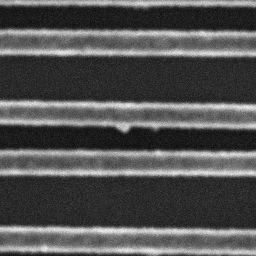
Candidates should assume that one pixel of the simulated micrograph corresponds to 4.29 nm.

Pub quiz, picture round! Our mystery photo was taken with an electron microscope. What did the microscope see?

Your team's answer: lines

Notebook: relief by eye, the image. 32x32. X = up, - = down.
X--XX--XXXXXXXXXXXXXXXXXXXXXXXXX
--------------------------------
--------------------------------
--------------------------------
XXXXXXXXXXXXXXXXXXXXXXXXXXXXXXXX
XXXXXXXXXXXXXXXXXXXXXXXXXXXXXXXX
XXXXXXXXXXXXXXXXXXXXXXXXXXXXXXXX
--------------------------------
--------------------------------
--------------------------------
--------------------------------
--------------------------------
--------------------------------
XXXXXXXXXXXXXXXXXXXXXXXXXXXXXXXX
XXXXXXXXXXXXXXXXXXXXXXXXXXXXXXXX
---XXXXXXXXXXXXXXXXXXXXXXXXXXXXX
--------------------------------
--------------------------------
--------------------------------
XXXXXXXXXXXXXXXXXXXXXXXXXXXXXXXX
XXXXXXXXXXXXXXXXXXXXXXXXXXXXXXXX
XXXXXXXXXXXXXXXXXXXXXXXXXXXXXXXX
--------------------------------
--------------------------------
--------------------------------
--------------------------------
--------------------------------
--------------------------------
-X------------------------------
XXXXXXXXXXXXXXXXXXXXXXXXXXXXXXXX
XXXXXXXXXXXXXXXXXXXXXXXXXXXXXXXX
--------X--XXXXXXXXXXXXXXXXXXXXX